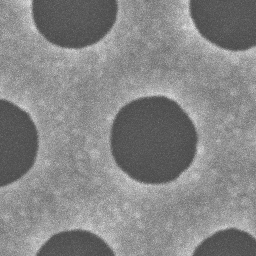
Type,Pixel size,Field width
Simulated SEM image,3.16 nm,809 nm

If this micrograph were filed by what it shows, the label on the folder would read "holes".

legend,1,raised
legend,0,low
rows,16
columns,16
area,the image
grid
1100000111110000
1100000111110000
1110001111111000
1111111111111111
1111111111111111
1111111111111111
0111111100011111
0011111000001111
0011111000001111
0011111000001111
0011111000001111
0111111110111111
1111111111111111
1111111111111111
1111001111111101
1110000111110000